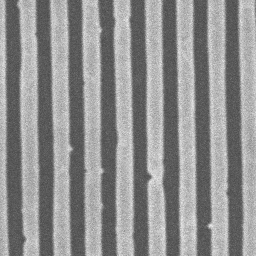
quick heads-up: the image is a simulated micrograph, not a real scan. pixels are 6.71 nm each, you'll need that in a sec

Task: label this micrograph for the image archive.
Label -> parallel lines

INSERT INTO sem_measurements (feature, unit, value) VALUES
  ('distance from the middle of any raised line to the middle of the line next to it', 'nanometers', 211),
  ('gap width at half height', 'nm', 105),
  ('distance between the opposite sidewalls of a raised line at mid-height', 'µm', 0.105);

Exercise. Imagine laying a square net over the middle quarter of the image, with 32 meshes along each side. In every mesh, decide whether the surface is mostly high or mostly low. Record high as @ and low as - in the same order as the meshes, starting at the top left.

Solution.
@----@@@@----@@@-----@@@-----@@@
@----@@@@----@@@-----@@@-----@@@
@----@@@@----@@@@----@@@-----@@@
@----@@@@----@@@@----@@@@----@@@
@----@@@@----@@@@----@@@@----@@@
@----@@@@----@@@@----@@@@----@@@
@----@@@@----@@@@----@@@@----@@@
@----@@@@----@@@@----@@@@----@@@
@----@@@@----@@@@----@@@@----@@@
@----@@@@----@@@@----@@@@----@@@
@----@@@@----@@@@----@@@@----@@@
@----@@@@----@@@@----@@@@----@@@
@----@@@@----@@@@----@@@@----@@@
@----@@@@----@@@@----@@@@----@@@
@----@@@@----@@@@----@@@@----@@@
@----@@@@----@@@@----@@@@----@@@
@----@@@@----@@@@----@@@@----@@@
@----@@@@-----@@@----@@@@----@@@
@----@@@@-----@@@----@@@@----@@@
@----@@@@-----@@@----@@@@----@@@
@@---@@@@----@@@@----@@@@----@@@
@@---@@@@----@@@@----@@@@----@@@
@----@@@@----@@@@----@@@@----@@@
@----@@@@----@@@@----@@@@----@@@
@----@@@@----@@@@----@@@-----@@@
@----@@@@----@@@@----@@@@----@@@
@-----@@@@---@@@@----@@@@----@@@
@----@@@@----@@@@----@@@@----@@@
@----@@@@----@@@@-----@@-----@@@
@----@@@@----@@@@----@@@-----@@@
@----@@@@----@@@@----@@@@----@@@
@----@@@@----@@@@----@@@@----@@@